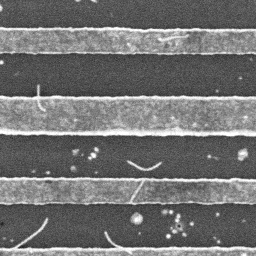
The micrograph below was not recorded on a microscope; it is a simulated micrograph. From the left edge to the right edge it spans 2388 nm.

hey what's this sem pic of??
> lines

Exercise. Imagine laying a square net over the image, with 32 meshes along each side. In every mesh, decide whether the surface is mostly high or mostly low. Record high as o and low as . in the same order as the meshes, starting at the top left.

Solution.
................................
................................
................................
o....o.oo.o..oo.................
oooooooooooooooooooooooooooooooo
oooooooooooooooooooooooooooooooo
oooooooooooooooooooooooooooooooo
................................
................................
................................
................................
................................
oooooooooooooooooooooooooooooooo
oooooooooooooooooooooooooooooooo
oooooooooooooooooooooooooooooooo
oooooooooooooooooooooooooooooooo
oooooooooooooooooooooooooooooooo
................................
................................
................................
................................
................................
ooooooooooooooooooooooooooooooo.
oooooooooooooooooooooooooooooooo
oooooooooooooooooooooooooooooooo
oo..oo....o.....o...o....oo....o
................................
................................
................................
................................
................................
oooooooooooooooooooooooooooooooo